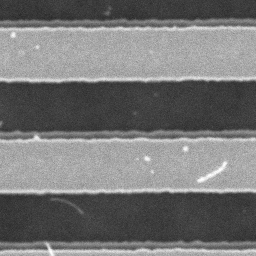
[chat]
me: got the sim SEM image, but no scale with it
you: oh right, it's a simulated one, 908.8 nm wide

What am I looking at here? lines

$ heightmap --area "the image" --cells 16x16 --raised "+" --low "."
................
++++++++++++++++
++++++++++++++++
++++++++++++++++
++++++++++++++++
................
................
................
++++++++++++++++
++++++++++++++++
++++++++++++++++
++++++++++++++++
................
................
................
++++++++++++++++